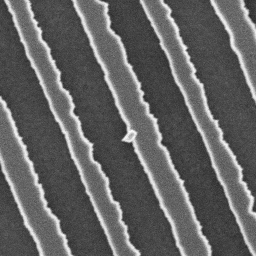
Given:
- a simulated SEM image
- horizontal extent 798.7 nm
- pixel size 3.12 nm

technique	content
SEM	lines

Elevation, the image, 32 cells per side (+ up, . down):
.+++.....++++.....+++......+++..
.+++......+++.....+++......++++.
..++......++++.....+++......+++.
..+++......+++.....+++......++++
..+++......++++.....++.......+++
...+++.....++++.....+++......+++
...+++......++++.....++......+++
....+++.....++++.....+++......++
....+++......+++.....+++......++
.....+++.....++++.....++.......+
.....+++......+++.....+++......+
......++......++++.....++......+
......+++.....++++.....+++......
+.....+++......++++.....++......
+......++......++++.....++......
++.....+++......++++....+++.....
++......++......++++.....+++....
+++.....+++.....++++.....+++....
+++......++......++++.....+++...
+++......+++.....++++.....+++...
++++.....+++......++++.....+++..
++++......+++.....++++.....+++..
.++++.....+++......++++....+++..
.++++......+++.....++++.....+++.
..+++......+++......+++.....+++.
..++++......+++.....++++.....+++
...+++......+++......+++.....+++
...++++.....+++......++++.....++
...++++......+++......+++.....++
....++++.....+++......+++.....++
.....+++......++......++++.....+
.....++++.....+++......+++.....+